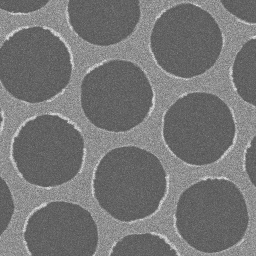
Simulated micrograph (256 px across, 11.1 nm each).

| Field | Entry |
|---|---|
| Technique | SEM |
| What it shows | holes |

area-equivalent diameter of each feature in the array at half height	0.799	microns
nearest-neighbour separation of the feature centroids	968	nm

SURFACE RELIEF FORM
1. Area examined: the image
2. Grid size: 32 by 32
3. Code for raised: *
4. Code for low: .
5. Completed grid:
......***........*****..****....
*...*****.........***.....***...
*********........***.......***..
***..****........**........*****
*......***......***.........****
........****..*****.........***.
.........**********.........**..
.........*****.*****.......**...
.........***.....***......***...
.........**.......****..*****...
........**.........**********...
*......***.........***********..
***...****.........***......**..
**********.........**........***
*****..****.......***........***
***......***.....***.........***
**........**********.........***
**........***********........***
**........*****..****........**.
**........***......***......***.
**........**........****..*****.
***.......**.........**********.
***......***.........****...***.
.***********.........**.......**
.***********.........**.......**
..****...***........**.........*
..**.......**......***.........*
.***........***..*****.........*
.**.........**********.........*
***.........****....***.......**
***.........***......***.....***
****........**........***..*****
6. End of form